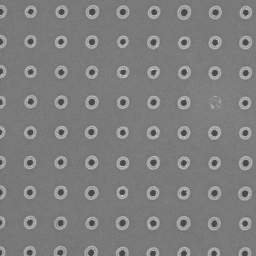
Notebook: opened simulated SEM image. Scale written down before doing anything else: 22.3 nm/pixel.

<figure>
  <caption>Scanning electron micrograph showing a regular array of ring-shaped raised bodies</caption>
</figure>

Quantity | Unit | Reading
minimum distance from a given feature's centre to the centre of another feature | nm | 666